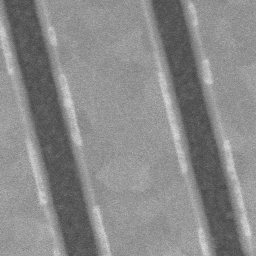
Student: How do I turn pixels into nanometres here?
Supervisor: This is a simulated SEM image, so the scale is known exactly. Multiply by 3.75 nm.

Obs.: one or a few lines or trenches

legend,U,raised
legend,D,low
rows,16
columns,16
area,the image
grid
DDDUUUUUUDDDUUUU
DDDUUUUUUDDDUUUU
DDDUUUUUUUDDUUUU
UDDUUUUUUUDDUUUU
UDDDUUUUUUDDDUUU
UDDDUUUUUUDDDUUU
UDDDUUUUUUUDDUUU
UUDDUUUUUUUDDUUU
UUDDDUUUUUUDDDUU
UUDDDUUUUUUDDDUU
UUDDDUUUUUUUDDUU
UUUDDUUUUUUUDDDU
UUUDDDUUUUUUDDDU
UUUDDDUUUUUUUDDU
UUUDDDUUUUUUUDDU
UUUUDDUUUUUUUDDU